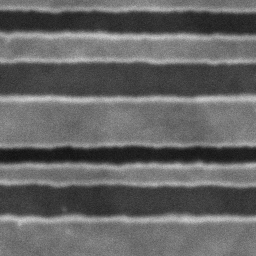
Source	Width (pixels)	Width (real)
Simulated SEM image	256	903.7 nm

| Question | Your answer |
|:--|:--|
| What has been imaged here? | lines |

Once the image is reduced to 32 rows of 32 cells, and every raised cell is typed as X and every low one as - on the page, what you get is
XXXXXXXXXXXXXXXXXXXXXXXXXXXXXXXX
-------------------------------X
--------------------------------
--------------------------------
XXXXXXXXXXXXXXXXXXXXXXXXX-XX----
XXXXXXXXXXXXXXXXXXXXXXXXXXXXXXXX
XXXXXXXXXXXXXXXXXXXXXXXXXXXXXXXX
XXXXXXXXXXXXXXXXXXXXXXXXXXXXXXXX
--------------------------------
--------------------------------
--------------------------------
--------------------------------
XXXXXXXXXXXXXXXXXXXXXXXXXXXXXXXX
XXXXXXXXXXXXXXXXXXXXXXXXXXXXXXXX
XXXXXXXXXXXXXXXXXXXXXXXXXXXXXXXX
XXXXXXXXXXXXXXXXXXXXXXXXXXXXXXXX
XXXXXXXXXXXXXXXXXXXXXXXXXXXXXXXX
XXXXXXXXXXXXXXXXXXXXXXXXXXXXXXXX
--------------------------------
--------------------------------
---X----X----------X----X------X
XXXXXXXXXXXXXXXXXXXXXXXXXXXXXXXX
XXXXXXXXXXXXXXXXXXXXXXXXXXXXXXXX
--------------------------------
--------------------------------
--------------------------------
--------------------------------
XXXXXXXXXXXXXXXXXXXXXXXXXXXXXXXX
XXXXXXXXXXXXXXXXXXXXXXXXXXXXXXXX
XXXXXXXXXXXXXXXXXXXXXXXXXXXXXXXX
XXXXXXXXXXXXXXXXXXXXXXXXXXXXXXXX
XXXXXXXXXXXXXXXXXXXXXXXXXXXXXXXX